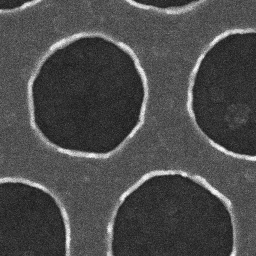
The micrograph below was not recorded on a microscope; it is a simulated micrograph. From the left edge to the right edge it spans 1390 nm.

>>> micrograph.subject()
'holes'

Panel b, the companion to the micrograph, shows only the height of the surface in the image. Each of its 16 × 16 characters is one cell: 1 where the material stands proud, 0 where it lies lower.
0111111111011111
1111111111111111
1111100111111100
1110000011111000
1100000001110000
1100000001110000
1100000001110000
1100000001110000
1110000011111000
1111100111111110
1111111111111111
0011111110000111
0001111100000011
0000111000000011
0000111000000001
0000111000000001